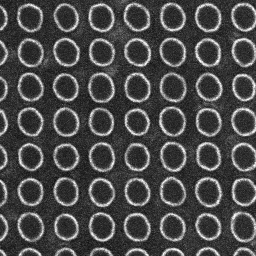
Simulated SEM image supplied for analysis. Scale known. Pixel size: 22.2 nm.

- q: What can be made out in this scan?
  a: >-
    a regular array of raised bodies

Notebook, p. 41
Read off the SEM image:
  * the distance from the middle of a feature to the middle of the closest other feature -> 34.8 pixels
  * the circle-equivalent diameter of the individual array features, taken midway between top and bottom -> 562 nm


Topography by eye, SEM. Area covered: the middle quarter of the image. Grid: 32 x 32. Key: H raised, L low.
LLLLLLLLLLLLLLLLLLLLLLLLLLLLLLLL
LLLLLLLLLLLLLLLLLLLLLLLLLLLLLLLL
LLLLLLLLLLLLLLLLLHHLLLLLLLHHLLLL
HHLLLLLHHHHLLLLLHHHHLLLLLHHHHLLL
HHHLLLLHHHHHLLLLHHHHHLLLHHHHHHLL
HHHLLLHHHHHHLLLLHHHHHLLLHHHHHHLL
HHHLLLHHHHHHLLLLHHHHHLLLHHHHHHLL
HHHLLLLHHHHHLLLLHHHHHLLLLHHHHHLL
HHLLLLLHHHHHLLLLHHHHHLLLLLHHHLLL
LLLLLLLLLLLLLLLLLLLLLLLLLLLLLLLL
LLLLLLLLLLLLLLLLLLLLLLLLLLLLLLLL
HLLLLLLLHHLLLLLLLLHLLLLLLHHHHLLL
HHHLLLLHHHHLLLLLHHHHLLLLHHHHHLLL
HHHLLLLHHHHHLLLLHHHHHLLLHHHHHHLL
HHHLLLHHHHHHLLLLHHHHHLLLHHHHHHLL
HHHLLLLHHHHHLLLLHHHHHLLLHHHHHHLL
HHHLLLLHHHHHLLLLHHHHHLLLLHHHHHLL
HHLLLLLLHHHLLLLLLHHLLLLLLLHHHLLL
LLLLLLLLLLLLLLLLLLLLLLLLLLLLLLLL
LLLLLLLLLLLLLLLLLLLLLLLLLLLLLLLL
HHLLLLLLHHHLLLLLLHHHLLLLLHHHHLLL
HHHLLLLHHHHHLLLLHHHHHLLLHHHHHHLL
HHHLLLHHHHHHLLLLHHHHHLLLHHHHHHLL
HHHHLLHHHHHHLLLLHHHHHLLLHHHHHHLL
HHHLLLLHHHHHLLLLHHHHHLLLLHHHHHLL
HHLLLLLHHHHHLLLLHHHHHLLLLHHHHLLL
LLLLLLLLLHHLLLLLLLLLLLLLLLLHLLLL
LLLLLLLLLLLLLLLLLLLLLLLLLLLLLLLL
LLLLLLLLLLLLLLLLLLLLLLLLLLHLLLLL
HHLLLLLHHHHLLLLLHHHHLLLLLHHHHLLL
HHHLLLLHHHHHLLLLHHHHHLLLHHHHHHLL
HHHLLLHHHHHHLLLLHHHHHLLLHHHHHHLL